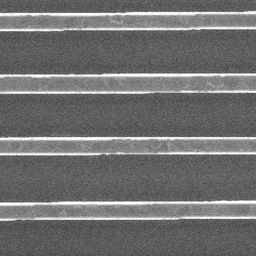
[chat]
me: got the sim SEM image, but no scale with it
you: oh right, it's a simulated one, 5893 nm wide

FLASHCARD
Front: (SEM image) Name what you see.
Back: lines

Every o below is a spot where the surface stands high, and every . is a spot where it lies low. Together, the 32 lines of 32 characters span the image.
................................
................................
oooooooooooooooooooooooooooooooo
oooooooooooooooooooooooooooooooo
................................
................................
................................
................................
................................
oooooooooooooooooooooooooooooooo
oooooooooooooooooooooooooooooooo
ooooooooooooooooo...............
................................
................................
................................
................................
................................
oooooooooooooooooooooooooooooooo
oooooooooooooooooooooooooooooooo
................................
................................
................................
................................
................................
................................
..oooooooooooooooooooooooooooooo
oooooooooooooooooooooooooooooooo
................................
................................
................................
................................
................................